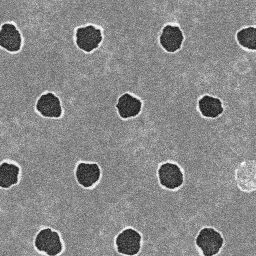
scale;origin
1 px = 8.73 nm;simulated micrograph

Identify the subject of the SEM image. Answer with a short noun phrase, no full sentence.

holes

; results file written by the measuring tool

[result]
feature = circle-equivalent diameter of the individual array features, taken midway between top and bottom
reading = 0.217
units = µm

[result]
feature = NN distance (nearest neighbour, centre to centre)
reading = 686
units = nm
